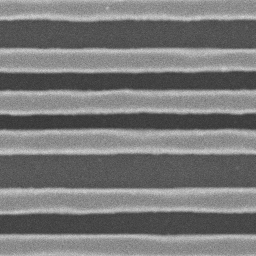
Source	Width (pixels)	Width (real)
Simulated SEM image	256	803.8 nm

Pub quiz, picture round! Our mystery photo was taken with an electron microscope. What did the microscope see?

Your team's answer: lines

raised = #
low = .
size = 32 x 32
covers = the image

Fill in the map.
################################
################################
##.....#######...###.####...#...
................................
................................
................................
################################
################################
################################
................................
................................
################################
################################
################################
................................
................................
################################
################################
################################
................................
................................
................................
................................
................................
################################
################################
##################......########
................................
................................
################################
################################
################################